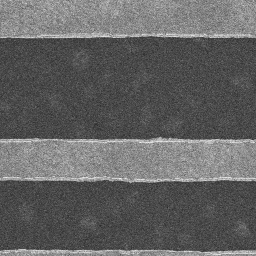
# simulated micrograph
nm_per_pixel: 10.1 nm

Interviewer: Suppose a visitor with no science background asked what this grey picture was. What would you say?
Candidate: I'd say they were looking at one or a few lines or trenches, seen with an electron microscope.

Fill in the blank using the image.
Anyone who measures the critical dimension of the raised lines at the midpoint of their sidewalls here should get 417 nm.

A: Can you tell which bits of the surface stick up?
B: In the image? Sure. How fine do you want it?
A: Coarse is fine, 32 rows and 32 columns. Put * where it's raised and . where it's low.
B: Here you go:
********************************
********************************
********************************
********************************
*****************...************
................................
................................
................................
................................
................................
................................
................................
................................
................................
................................
................................
................................
.*.****.........********.*******
********************************
********************************
********************************
********************************
*.*************************.....
................................
................................
................................
................................
................................
................................
................................
................................
*************************..*****